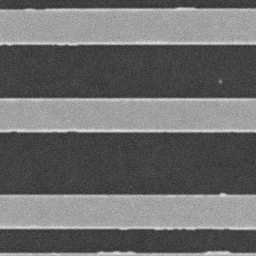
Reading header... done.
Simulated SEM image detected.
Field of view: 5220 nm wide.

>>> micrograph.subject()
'lines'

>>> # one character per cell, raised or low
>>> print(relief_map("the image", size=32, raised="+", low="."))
................................
++++++++++++++++++++++++++++++++
++++++++++++++++++++++++++++++++
++++++++++++++++++++++++++++++++
++++++++++++++++++++++++++++++++
................................
................................
................................
................................
................................
................................
................................
++++++++++++++++++++++++++++++++
++++++++++++++++++++++++++++++++
++++++++++++++++++++++++++++++++
++++++++++++++++++++++++++++++++
................................
................................
................................
................................
................................
................................
................................
................................
++++++++++++++++++++++++++++++++
++++++++++++++++++++++++++++++++
++++++++++++++++++++++++++++++++
++++++++++++++++++++++++++++++++
++++++++++++++++++++++++++++++++
................................
................................
................................